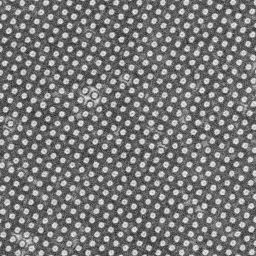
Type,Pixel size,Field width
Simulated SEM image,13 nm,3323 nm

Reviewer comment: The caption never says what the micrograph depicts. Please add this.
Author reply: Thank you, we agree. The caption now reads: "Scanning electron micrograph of a regular array of raised bodies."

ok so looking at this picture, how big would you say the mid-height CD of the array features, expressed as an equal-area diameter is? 65.5 nm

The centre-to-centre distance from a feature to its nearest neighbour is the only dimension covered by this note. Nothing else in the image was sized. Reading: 131 nm